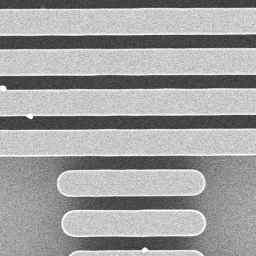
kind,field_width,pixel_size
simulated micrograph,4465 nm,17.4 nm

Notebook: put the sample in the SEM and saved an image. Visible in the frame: groups of lines, slits or small figures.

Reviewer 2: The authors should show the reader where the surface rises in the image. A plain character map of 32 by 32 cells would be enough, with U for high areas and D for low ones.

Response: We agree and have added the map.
DDDDDDDDDDDDDDDDDDDDDDDDDDDDDDDD
UUUUUUUUUUUUUUUUUUUUUUUUUUUUUUUU
UUUUUUUUUUUUUUUUUUUUUUUUUUUUUUUU
UUUUUUUUUUUUUUUUUUUUUUUUUUUUUUUU
DDDDDDDDDDDDDDDDDDDDDDDDDDDDDDDD
DDDDDDDDDDDDDDDDDDDDDDDDDDDDDDDD
UUUUUUUUUUUUUUUUUUUUUUUUUUUUUUUU
UUUUUUUUUUUUUUUUUUUUUUUUUUUUUUUU
UUUUUUUUUUUUUUUUUUUUUUUUUUUUUUUU
DDDDDDDDDDDDDDDDDDDDDDDDDDDDDDDD
DDDDDDDDDDDDDDDDDDDDDDDDDDDDDDDD
UUUUUUUUUUUUUUUUUUUUUUUUUUUUUUUU
UUUUUUUUUUUUUUUUUUUUUUUUUUUUUUUU
UUUUUUUUUUUUUUUUUUUUUUUUUUUUUUUU
DDDUDDDDDDDDDDDDDDDDDDDDDDDDDDDD
DDDDDDDDDDDDDDDDDDDDDDDDDDDDDDDD
UUUUUUUUUUUUUUUUUUUUUUUUUUUUUUUU
UUUUUUUUUUUUUUUUUUUUUUUUUUUUUUUU
UUUUUUUUUUUUUUUUUUUUUUUUUUUUUUUU
DDDDDDDDDDDDDDDDDDDDDDDDDDDDDDDD
DDDDDDDDDDDDDDDDDDDDDDDDDDDDDDDD
DDDDDDDDUUUUUUUUUUUUUUUUUDDDDDDD
DDDDDDDUUUUUUUUUUUUUUUUUUUDDDDDD
DDDDDDDUUUUUUUUUUUUUUUUUUDDDDDDD
DDDDDDDDUUUUUUDDDDDDDDDDDDDDDDDD
DDDDDDDDDDDDDDDDDDDDDDDDDDDDDDDD
DDDDDDDDDUUUUUUUUUUUUUUUUDDDDDDD
DDDDDDDDUUUUUUUUUUUUUUUUUUDDDDDD
DDDDDDDDUUUUUUUUUUUUUUUUUUDDDDDD
DDDDDDDDDUUDDDDDDUDDDDDDDDDDDDDD
DDDDDDDDDDDDDDDDDDDDDDDDDDDDDDDD
DDDDDDDDDUUUUUUUUUUUUUUUUDDDDDDD